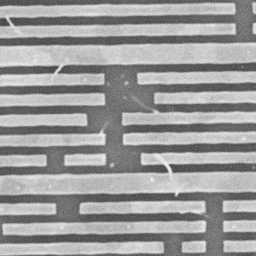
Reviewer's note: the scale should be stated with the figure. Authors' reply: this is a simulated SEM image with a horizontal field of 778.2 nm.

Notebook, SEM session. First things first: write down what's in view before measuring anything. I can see groups of lines, slits or small figures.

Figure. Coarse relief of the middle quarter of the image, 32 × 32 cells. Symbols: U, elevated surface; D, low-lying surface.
DDDDDDDDDDDDDDDDDDDDDDDDDDDDDDDD
DDDDDDDDDDDDDDDDDDDDDDDDDDDDDDDD
DDDDDDDDDUDDDDDDDDDUUUUUUUUUUUUU
UUUUUUUUUUDDDDDDDDDUUUUUUUUUUUUU
UUUUUUUUUUDDDDDDDDDUUUUUUUUUUUUU
DDDDDDDDDDDDDDDDDDDDDDDDDDDDDDDD
DDDDDDDDDDDDDDDDDDDDDDDDDDDDDDDD
DDDDDDUUUUDDDDDDDDDDDDDUUUUUUUUU
UUUUUUUUUUDDDDDDDDDDDDDUUUUUUUUU
UUUUUUUUUUDDDDDDDDDDDDDUUUUUUUUU
DDDDDDDDDDDDDDDDDDDDDDDDDDDDDDDD
DDDDDDDDDDDDDDDDDDDDDDDDDDDDDDDD
DDUUDDDDDDDDDDDUUUUUUUUUUUUUUUUU
UUUUUUDDDDDDDDDUUUUUUUUUUUUUUUUU
UUUUUUDDDDDDDDDUUUUUUUUUUUUUUUUU
DDDDDDDDDDDDDDDDDDDDDDDDDDDDDDDD
DDDDDDDDDDDDDDDDDDDDDDDDDDDDDDDD
DDDDDDDDDUDDDDDDUUUUUUUUUUUUUUUU
UUUUUUUUUUDDDDDUUUUUUUUUUUUUUUUU
UUUUUUUUUUDDDDDUUUUUUUUUUUUUUUUU
DDDDDDDDDDDDDDDDDDDDDDDDDDDDDDDD
DDDDDDDDDDDDDDDDDDDDDDDDDDDDDDDD
DDDDDDDDDDDDDDDDDDDUUDUUUUUUUUUU
DUUUUUUUUUDDDDDDDDDUUUUUUUUUUUUU
DUUUUUUUUUDDDDDDDDDUUUUUUUUUUUUU
DDDDDDDDDDDDDDDDDDDDDDDDDDDDDDDD
DDDDDDDDDDDDDDDDDDDDDDDDDDUDDDDD
DDDDDDDDDDDDDDUUUUUUUUUUUUUUUUUU
UUUUUUUUUUUUUUUUUUUUUUUUUUUUUUUU
UUUUUUUUUUUUUUUUUUUUUUUUUUUUUUUU
UUUUUUUUUUUUUUUUUUUUUUUUUUUUUUUU
UUUUUUUUUUUUUUUUUUUUUUUUUUUUUUUU